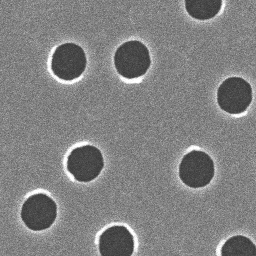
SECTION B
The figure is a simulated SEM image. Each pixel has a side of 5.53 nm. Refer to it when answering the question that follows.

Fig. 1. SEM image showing holes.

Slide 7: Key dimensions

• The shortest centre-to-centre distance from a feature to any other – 0.373 micrometres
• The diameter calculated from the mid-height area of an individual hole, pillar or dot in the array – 36.6 pixels